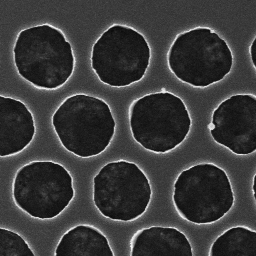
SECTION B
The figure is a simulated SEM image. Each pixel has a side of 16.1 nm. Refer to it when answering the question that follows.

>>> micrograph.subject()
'a regular array of holes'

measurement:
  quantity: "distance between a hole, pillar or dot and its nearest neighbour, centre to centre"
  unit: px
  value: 75.9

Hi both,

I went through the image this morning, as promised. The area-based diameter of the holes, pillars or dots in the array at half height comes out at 0.956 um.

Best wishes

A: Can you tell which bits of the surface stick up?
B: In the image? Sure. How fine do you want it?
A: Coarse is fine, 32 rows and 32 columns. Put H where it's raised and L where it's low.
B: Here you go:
HHHHHHHHHHHHHHHHHHHHHHHHHHHHHHHH
HHHHHHHHHHHHHHHHHHHHHHHHHHHHHHHH
HHHHHHHHHHHHHHHHHHHHHHHHHHHHHHHH
HHHHLLLHHHHHHHLLHHHHHHHHHHHHHHHH
HHLLLLLLHHHHHLLLLLHHHHLLLLLHHHHH
HHLLLLLLLHHHLLLLLLHHHHLLLLLLHHHL
HHLLLLLLLHHHLLLLLLLHHLLLLLLLLHHL
HHLLLLLLLHHLLLLLLLLHHLLLLLLLLHHL
HHLLLLLLLHHHLLLLLLHHHLLLLLLLLHHH
HHHLLLLLLHHHLLLLLLHHHHLLLLLLHHHH
HHHHLLLLHHHHHLLLHHHHHHHHLLHHHHHH
HHHHHHHHHHHHHHHHHHHHHHHHHHHHHHHH
LLHHHHHHLLLLLHHHHLLLLLLHHHHHLLLL
LLLHHHHLLLLLLLHHLLLLLLLHHHHLLLLL
LLLLHHHLLLLLLLHHLLLLLLLLHHHLLLLL
LLLLHHHLLLLLLLHHLLLLLLLLHHHLLLLL
LLLLHHHLLLLLLLHHHLLLLLLHHHLLLLLL
LLLLHHHHLLLLLLHHHLLLLLLHHHHLLLLL
LLLHHHHHLLLLLHHHHHLLLLHHHHHHHLLL
HHHHHHHHHHLHHHHHHHHHHHHHHHHHHHHH
HHHHLLLHHHHHHLLLLHHHHHHHHLHHHHHH
HHLLLLLLHHHHLLLLLLHHHHHLLLLLHHHH
HHLLLLLLLHHHLLLLLLHHHHLLLLLLLHHH
HHLLLLLLLHHHLLLLLLLHHHLLLLLLLHHH
HHLLLLLLLHHHLLLLLLLHHHLLLLLLLHHH
HHLLLLLLHHHHLLLLLLHHHHLLLLLLLHHH
HHHLLLLHHHHHHLLLLLHHHHLLLLLLHHHH
HHHHHHHHHHHHHHHLHHHHHHHHLLLHHHHH
HHHHHHHHHLLHHHHHHHHLLHHHHHHHHLHH
LLHHHHHHLLLLLHHHHLLLLLLHHHHHLLLL
LLLHHHHLLLLLLLHHHLLLLLLLHHHLLLLL
LLLLHHHLLLLLLLHHHLLLLLLLHHLLLLLL